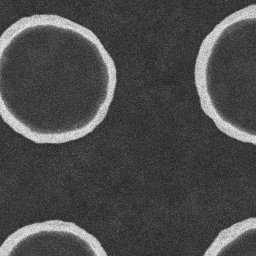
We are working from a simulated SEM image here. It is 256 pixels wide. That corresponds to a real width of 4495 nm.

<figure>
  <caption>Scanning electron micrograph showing raised bodies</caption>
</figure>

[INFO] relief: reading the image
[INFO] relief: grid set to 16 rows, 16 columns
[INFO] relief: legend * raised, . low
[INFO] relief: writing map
................
..**..........**
******.......***
*******......***
*******......***
*******......***
*******......***
.*****........**
..**...........*
................
................
................
................
................
..***..........*
******.......***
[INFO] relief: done